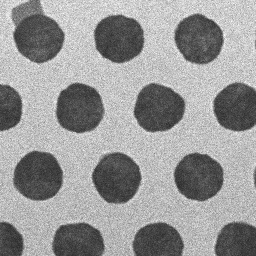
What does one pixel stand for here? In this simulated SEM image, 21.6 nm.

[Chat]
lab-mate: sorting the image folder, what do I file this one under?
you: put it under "holes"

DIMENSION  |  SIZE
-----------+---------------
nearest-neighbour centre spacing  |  1700 nm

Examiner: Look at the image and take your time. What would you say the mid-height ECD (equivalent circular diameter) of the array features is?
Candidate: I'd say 1070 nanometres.